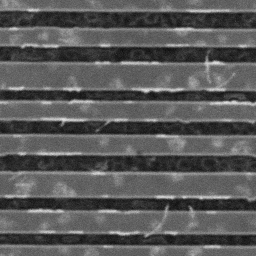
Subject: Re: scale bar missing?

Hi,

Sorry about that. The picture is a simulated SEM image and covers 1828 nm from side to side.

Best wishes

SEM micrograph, parallel lines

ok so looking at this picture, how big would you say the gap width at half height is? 104 nanometres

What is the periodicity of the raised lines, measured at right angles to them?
264 nanometres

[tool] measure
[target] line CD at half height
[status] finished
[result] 0.159 microns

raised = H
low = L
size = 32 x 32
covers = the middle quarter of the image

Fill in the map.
HHHHHHHHHHHHHHHHHHHHHHHHHHHHHHHH
HHHHHHHHHHHHHHHHHHHHHHHHHHHHHHHH
HHHHHHHHHHHHHHHHHHHHHHHHHHHHHHHH
HHHHHHHHHHHHHHHHHHHHHHHHHHHHHHHH
HHHHHHHHHHHHHHHHHHHHHHHHHHHHHHHH
HHHHHHHHHHHHHHHHHHHHHHHHHHHHHHHH
LHHHHLLLLLLLLLLLLHHHHHHHHHHHHHLL
LLLLLLLLLLLLLLLLLLLLLLLLLLLLLLLL
LLLLLLLLLLLLLLLLLLLLLLLLLLLLLLLL
HHHHHHHHHHHHHHHHHHHHHHLLLLLLLLLL
HHHHHHHHHHHHHHHHHHHHHHHHHHHHHHHH
HHHHHHHHHHHHHHHHHHHHHHHHHHHHHHHH
HHHHHHHHHHHHHHHHHHHHHHHHHHHHHHHH
HHHHHHHHHHHHHHHHHHHHHHHHHHHHHHHH
LLLLLLLLLLLHLLLLLLLLLLLLLLLLLLHL
LLLLLLLLLLLLLLLLLLLLLLLLLLLLLLLL
LLLLLLLLLLLLLLLLLLLLLLLLLLLLLLLL
LLLLLLLLLLLLLLLLLLLLLLLLLLLLLLLL
HHHHHHHHHHHHHHHHHHHHHHHHHHHHHHHH
HHHHHHHHHHHHHHHHHHHHHHHHHHHHHHHH
HHHHHHHHHHHHHHHHHHHHHHHHHHHHHHHH
HHHHHHHHHHHHHHHHHHHHHHHHHHHHHHHH
HHHHHHHHHHHHHHHHHHHHHHHHHHHHHHHH
LLLLLLLLLLLLLLLLLLLLLLLLLLLLLLLL
LLLLLLLLLLLLLLLLLLLLLLLLLLLLLLLL
LLLLLLLLLLLLLLLLLLLLLLLLLLLLLLLL
LLLLLLLLLLLLLLLLLLLLLLLLLLLLLLLL
HHHHHHHHHHHHHHHHHHHHHHHHHHHHHHHH
HHHHHHHHHHHHHHHHHHHHHHHHHHHHHHHH
HHHHHHHHHHHHHHHHHHHHHHHHHHHHHHHH
HHHHHHHHHHHHHHHHHHHHHHHHHHHHHHHH
HHHHHHHHHHHHHHHHHHHHHHHHHHHHHHHH